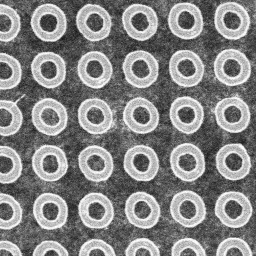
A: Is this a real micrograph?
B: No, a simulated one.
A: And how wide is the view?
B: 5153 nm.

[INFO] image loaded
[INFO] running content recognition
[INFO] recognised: a regular array of ring-shaped raised bodies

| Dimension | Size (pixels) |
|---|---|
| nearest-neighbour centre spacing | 45.7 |